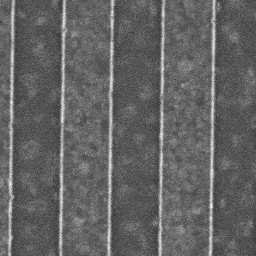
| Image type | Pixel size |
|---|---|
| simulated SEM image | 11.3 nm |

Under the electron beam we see one or a few lines or trenches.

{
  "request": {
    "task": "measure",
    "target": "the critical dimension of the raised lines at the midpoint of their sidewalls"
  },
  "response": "560 nm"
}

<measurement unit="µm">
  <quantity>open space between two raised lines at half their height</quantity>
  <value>0.571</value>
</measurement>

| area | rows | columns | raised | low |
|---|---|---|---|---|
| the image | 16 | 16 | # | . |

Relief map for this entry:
#...###...###...
#...###...###...
#...###...###...
#...###...###...
#...###...###...
#...###...###...
#...###...###...
#...###...###...
#...###...###...
#...###...###...
#...###...###...
#...###...###...
#...###...###...
#...###...###...
#...###...###...
#...###...###...